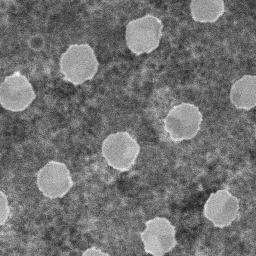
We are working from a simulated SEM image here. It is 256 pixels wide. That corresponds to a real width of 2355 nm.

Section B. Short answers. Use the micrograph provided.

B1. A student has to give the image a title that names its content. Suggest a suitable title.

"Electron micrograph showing raised bodies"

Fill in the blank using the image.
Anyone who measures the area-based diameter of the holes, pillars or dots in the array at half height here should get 36.1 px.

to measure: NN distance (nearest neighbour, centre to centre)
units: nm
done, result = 655